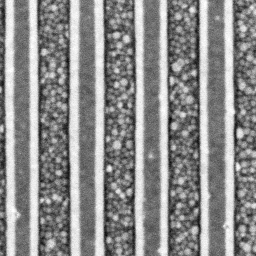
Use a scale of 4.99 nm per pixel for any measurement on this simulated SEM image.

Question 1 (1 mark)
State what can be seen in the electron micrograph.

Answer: one or a few lines or trenches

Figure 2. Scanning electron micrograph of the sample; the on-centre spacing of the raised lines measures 324 nm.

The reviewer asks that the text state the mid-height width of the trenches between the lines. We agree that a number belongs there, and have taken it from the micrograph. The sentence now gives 199 nm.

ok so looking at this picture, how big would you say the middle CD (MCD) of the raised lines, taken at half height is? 25 px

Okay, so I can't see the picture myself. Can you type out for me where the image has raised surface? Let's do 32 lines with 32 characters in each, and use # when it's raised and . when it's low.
.###.....###.....###.....####...
.###.....###.....###.....###....
.###.....###.....###.....###....
.###.....###.....###.....####...
.###.....###.....###.....####...
.###.....###.....###.....####...
.###.....###.....###.....####...
.###.....###.....###.....####...
.###.....###.....###.....####...
.###.....###.....###.....####...
.###.....###.....###.....####...
.###.....###.....###.....####...
.###.....###.....###.....####...
.###.....####....####....####...
.###.....####....####....####...
.###.....###.....####....####...
.###.....###.....####.....###...
.###.....###.....####.....###...
.###.....###......###.....###...
.###.....###.....####.....###...
.###.....###.....####.....###...
.###.....###.....####.....###...
.###.....###.....####.....###...
.###.....###.....####.....###...
.###.....###.....####.....###...
.###.....###.....####.....###...
.###.....###.....####.....###...
.###.....###.....###......###...
.###.....###.....###......###...
.###.....###.....###......###...
.###.....###.....###......###...
.###.....###.....###......###...